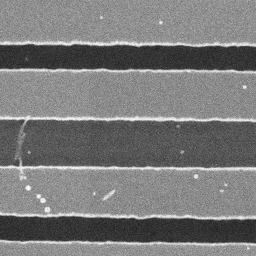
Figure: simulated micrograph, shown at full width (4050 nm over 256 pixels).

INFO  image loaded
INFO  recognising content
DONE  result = lines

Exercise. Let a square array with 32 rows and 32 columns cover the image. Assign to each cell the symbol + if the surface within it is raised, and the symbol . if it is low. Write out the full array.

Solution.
++++++++++++++++++++++++++++++++
++++++++++++++++++++++++++++++++
++++++++++++++++++++++++++++++++
++++++++++++++++++++++++++++++++
++++++++++++++++++++++++++++++++
++++++++++++++++++++++++++++++++
................................
................................
................................
++++++++++++++++++++++++++++++++
++++++++++++++++++++++++++++++++
++++++++++++++++++++++++++++++++
++++++++++++++++++++++++++++++++
++++++++++++++++++++++++++++++++
++++++++++++++++++++++++++++++++
................................
................................
................................
................................
................................
................................
++++++++++++++++++++++++++++++++
++++++++++++++++++++++++++++++++
++++++++++++++++++++++++++++++++
++++++++++++++++++++++++++++++++
++++++++++++++++++++++++++++++++
++++++++++++++++++++++++++++++++
................................
................................
................................
+++++++++++++++++++++++++.++++++
++++++++++++++++++++++++++++++++